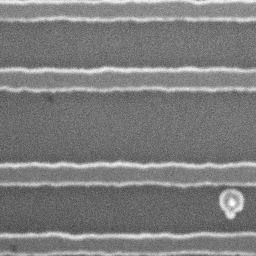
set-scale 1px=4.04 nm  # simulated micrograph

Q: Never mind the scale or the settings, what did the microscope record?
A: lines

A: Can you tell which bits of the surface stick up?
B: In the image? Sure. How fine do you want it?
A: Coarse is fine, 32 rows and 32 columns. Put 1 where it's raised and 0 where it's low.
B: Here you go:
11111111111111111111111111111111
11111111111111111111111111111111
00111000000111000100000010000010
00000000000000000000000000000000
00000000000000000000000000000000
00000000000000000000000000000000
00000000000000000000000000000000
00000000000000000000000000000000
00000000000000000000000000000000
11111111111111111111111111111111
11111111111111111111111111111111
00000000000000000000000000000000
00000000000000000000000000000000
00000000000000000000000000000000
00000000000000000000000000000000
00000000000000000000000000000000
00000000000000000000000000000000
00000000000000000000000000000000
00000000000000000000000000000000
00000000000000000000000000000000
00000000000000000000000000000000
11111111111111111111111111111111
11111111111111111111111111111111
00000000000000000000000000000000
00000000000000000000000000001100
00000000000000000000000000001100
00000000000000000000000000000000
00000000000000000000000000000000
00000000000000000000000000000000
11111111101101111111110111111111
11111111111111111111111111111111
11111111111111111111111111111111